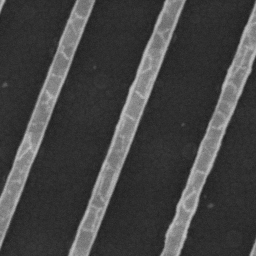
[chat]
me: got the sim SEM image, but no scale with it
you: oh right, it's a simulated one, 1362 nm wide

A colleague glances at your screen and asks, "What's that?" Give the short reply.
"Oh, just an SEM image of one or a few lines or trenches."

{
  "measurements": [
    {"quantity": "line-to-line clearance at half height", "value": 362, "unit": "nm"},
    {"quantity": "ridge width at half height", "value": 0.0858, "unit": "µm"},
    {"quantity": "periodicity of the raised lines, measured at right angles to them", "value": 0.448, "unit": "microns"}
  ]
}